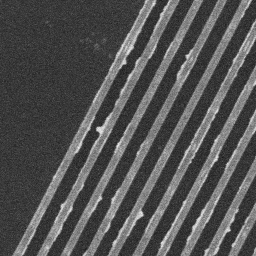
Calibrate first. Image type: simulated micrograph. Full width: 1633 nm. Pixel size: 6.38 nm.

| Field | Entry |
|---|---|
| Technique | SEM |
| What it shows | parallel lines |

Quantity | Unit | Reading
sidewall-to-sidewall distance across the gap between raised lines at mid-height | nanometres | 82.7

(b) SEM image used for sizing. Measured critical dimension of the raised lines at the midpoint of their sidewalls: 50.2 nanometres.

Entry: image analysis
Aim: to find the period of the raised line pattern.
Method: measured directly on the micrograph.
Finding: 135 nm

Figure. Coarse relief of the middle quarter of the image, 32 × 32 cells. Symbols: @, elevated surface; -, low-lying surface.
------------@@@---@@----@@---@@@
-----------@@@---@@@----@@---@@@
-----------@@----@@----@@---@@@-
----------@@@---@@@---@@@---@@@-
----------@@----@@----@@----@@--
----------@@---@@@---@@----@@---
---------@@---@@@----@@----@@---
--------@@@---@@@---@@----@@----
--------@@----@@----@@----@@----
-------@@----@@@---@@----@@----@
-------@@----@@----@@----@@----@
------@@----@@@---@@----@@----@@
------@@---@@@----@@----@@----@@
-----@@@---@@----@@----@@----@@-
-----@@---@@@----@@----@@----@@-
----@@@--@@@----@@----@@----@@--
----@@--@@@@---@@@----@@----@@--
---@@@---@@----@@----@@----@@---
---@@----@@---@@@---@@@----@@---
--@@@---@@----@@----@@----@@----
--@@---@@@---@@@---@@@----@@---@
-@@@---@@----@@----@@----@@----@
-@@---@@@---@@@---@@@---@@@---@@
@@----@@----@@----@@----@@----@@
@@----@@---@@@---@@@---@@----@@@
@----@@----@@----@@----@@----@@-
@---@@@---@@@---@@@---@@----@@@-
----@@----@@----@@----@@----@@--
----@@---@@----@@----@@----@@---
---@@----@@----@@----@@----@@---
--@@@---@@----@@----@@----@@----
--@@----@@---@@@----@@----@@----